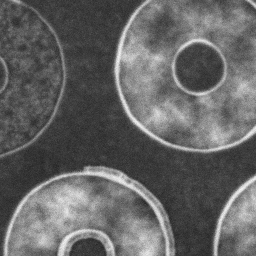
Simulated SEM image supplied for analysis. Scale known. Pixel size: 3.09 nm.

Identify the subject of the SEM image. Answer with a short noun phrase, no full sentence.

ring-shaped grooves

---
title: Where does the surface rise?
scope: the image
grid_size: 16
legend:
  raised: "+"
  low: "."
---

+++++++++.......
++++++++........
++++++++........
+++++++....+++..
+++++++....+++..
+++++++....++...
++++++++........
++++++++........
++++++++++.....+
++++++++++++++++
++++++++++++++++
+++.....+++++++.
++.......++++++.
+.........++++..
+....+....++++..
....+++...++++..